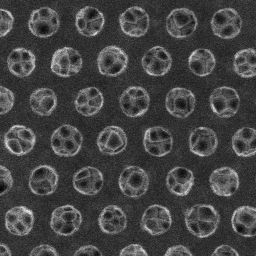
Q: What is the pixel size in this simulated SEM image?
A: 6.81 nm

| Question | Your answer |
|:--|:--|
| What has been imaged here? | a regular array of raised bodies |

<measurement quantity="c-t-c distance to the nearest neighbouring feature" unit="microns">0.296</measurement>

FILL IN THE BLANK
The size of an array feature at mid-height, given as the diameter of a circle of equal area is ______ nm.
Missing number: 170